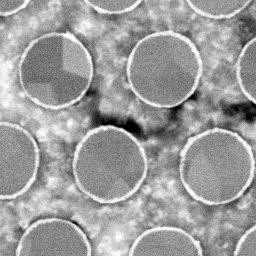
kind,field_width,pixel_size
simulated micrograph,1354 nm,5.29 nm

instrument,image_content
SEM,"raised bodies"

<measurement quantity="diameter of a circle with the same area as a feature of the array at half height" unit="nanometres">395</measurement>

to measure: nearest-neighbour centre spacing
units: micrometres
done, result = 0.571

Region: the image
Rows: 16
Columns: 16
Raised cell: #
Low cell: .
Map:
#.....##....###.
................
..###....###....
.#####..####...#
.#####..#####..#
.####...####...#
..##.....##.....
................
##...###....###.
##...####..#####
##...####..#####
##...####...####
......##....##..
................
..###....##....#
.#####..####...#